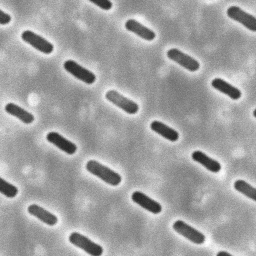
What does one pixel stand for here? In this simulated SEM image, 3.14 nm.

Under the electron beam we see a regular array of holes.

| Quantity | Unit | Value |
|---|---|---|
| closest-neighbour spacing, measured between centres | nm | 163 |